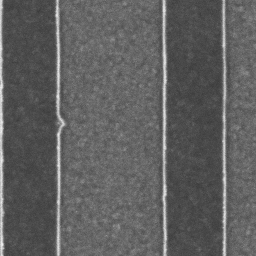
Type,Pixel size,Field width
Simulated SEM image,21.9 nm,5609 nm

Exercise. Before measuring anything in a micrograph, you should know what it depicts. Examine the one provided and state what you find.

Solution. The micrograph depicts one or a few lines or trenches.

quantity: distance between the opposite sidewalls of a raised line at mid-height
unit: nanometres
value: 1310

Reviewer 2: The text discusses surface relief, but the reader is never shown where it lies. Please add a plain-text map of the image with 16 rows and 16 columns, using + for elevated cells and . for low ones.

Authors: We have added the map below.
++++......++++..
++++......++++..
++++......++++..
++++......++++..
++++......++++..
++++......++++..
++++......++++..
++++......++++..
++++......++++..
++++......++++..
++++......++++..
++++......++++..
++++......++++..
++++......++++..
++++......++++..
++++......++++..